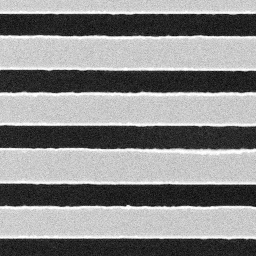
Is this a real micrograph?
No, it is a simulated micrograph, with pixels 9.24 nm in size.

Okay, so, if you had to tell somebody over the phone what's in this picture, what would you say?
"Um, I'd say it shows lines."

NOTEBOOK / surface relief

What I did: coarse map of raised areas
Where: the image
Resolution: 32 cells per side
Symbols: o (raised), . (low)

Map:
oooooooooooooooooooooooooooooooo
oooooooooooooooooooooooooooooooo
................................
................................
oooooooo..oooo.......o..oo......
oooooooooooooooooooooooooooooooo
oooooooooooooooooooooooooooooooo
oooooooooooooooooooooooooooooooo
oooooooooooooooooooooooooooooooo
................................
................................
................................
oooooooooooooooooooooooooooooooo
oooooooooooooooooooooooooooooooo
oooooooooooooooooooooooooooooooo
oooooooooooooooooooooooooooooooo
................................
................................
................................
oooooooooooooooooooooooooooooooo
oooooooooooooooooooooooooooooooo
oooooooooooooooooooooooooooooooo
oooooooooooooooooooooooooooooooo
................................
................................
................................
oooooooooooooooooooooooooooooooo
oooooooooooooooooooooooooooooooo
oooooooooooooooooooooooooooooooo
oooooooooooooooooooooooooooooooo
................................
................................